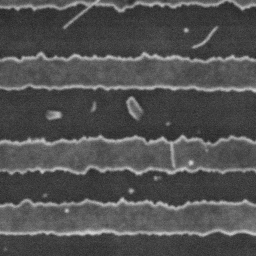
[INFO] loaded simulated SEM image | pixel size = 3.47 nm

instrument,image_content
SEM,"lines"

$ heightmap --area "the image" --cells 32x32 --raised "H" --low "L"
HHHHHHHHHHHHHHHHHHHHHHHHHHHHLHHH
LLLLLLLLLLLLLLLLLLLLLLLLLLLLLLLL
LLLLLLLLLLLLLLLLLLLLLLLLLLLLLLLL
LLLLLLLLLLLLLLLLLLLLLLLLLLLLLLLL
LLLLLLLLLLLLLLLLLLLLLLLLLLLLLLLL
LLLLLLLLLLLLLLLLLLLLLLLLLLLLLLLL
LLLLLLLLLLLLLLLLLLLLLLLLLLLLLLLL
HHHHHHHHHHHHHHHHHHHHHHHHHLHHHHHH
HHHHHHHHHHHHHHHHHHHHHHHHHHHHHHHH
HHHHHHHHHHHHHHHHHHHHHHHHHHHHHHHH
HHHHHHHHHHHHHHHHHHHHHHHHHHHHHHHH
LLLLLLLLLLLLLLLLLLLLLLLLLLLLLLLL
LLLLLLLLLLLLLLLLHLLLLLLLLLLLLLLL
LLLLLLLLLLLLLLLLHLLLLLLLLLLLLLLL
LLLLLLLLLLLLLLLLLLLLLLLLLLLLLLLL
LLLLLLLLLLLLLLLLLLLLLLLLLLLLLLLL
LLLLLLLLLLLLLLLLLLLLLLLLLLLLLLLL
LLLLLLLHLLHHHHHHHHLLHLHHHLLHHHHL
HHHHHHHHHHHHHHHHHHHHHHHHHHHHHHHH
HHHHHHHHHHHHHHHHHHHHHHHHHHHHHHHH
HHHHHHHHHHHHHHHHHHHHHHHHHHHHHHHH
LHHLLHLLLHHLLLLLLHLLLHLLLLLHLLLL
LLLLLLLLLLLLLLLLLLLLLLLLLLLLLLLL
LLLLLLLLLLLLLLLLLLLLLLLLLLLLLLLL
LLLLLLLLLLLLLLLLLLLLLLLLLLLLLLLL
LLHHHHHLHHHHHHHHHHHHHLLHHHHHHHHH
HHHHHHHHHHHHHHHHHHHHHHHHHHHHHHHH
HHHHHHHHHHHHHHHHHHHHHHHHHHHHHHHH
HHHHHHHHHHHHHHHHHHHHHHHHHHHHHHHH
LLLLLLLLLLLLLLLLLLLLLLLLLLLLLLLL
LLLLLLLLLLLLLLLLLLLLLLLLLLLLLLLL
LLLLLLLLLLLLLLLLLLLLLLLLLLLLLLLL